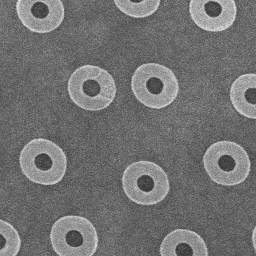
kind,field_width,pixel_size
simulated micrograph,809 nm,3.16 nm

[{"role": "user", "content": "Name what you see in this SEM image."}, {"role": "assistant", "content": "ring-shaped raised bodies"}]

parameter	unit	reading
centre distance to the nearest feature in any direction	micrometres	0.266